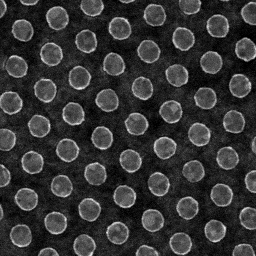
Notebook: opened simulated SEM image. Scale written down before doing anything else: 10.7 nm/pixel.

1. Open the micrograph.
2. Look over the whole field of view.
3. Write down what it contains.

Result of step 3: a regular array of raised bodies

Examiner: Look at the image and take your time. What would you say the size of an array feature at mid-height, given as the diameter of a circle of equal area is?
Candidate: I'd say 238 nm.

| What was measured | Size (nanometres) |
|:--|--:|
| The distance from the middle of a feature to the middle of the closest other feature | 389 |